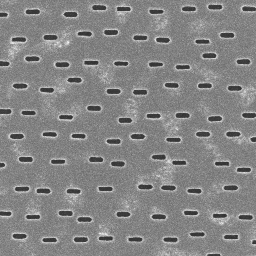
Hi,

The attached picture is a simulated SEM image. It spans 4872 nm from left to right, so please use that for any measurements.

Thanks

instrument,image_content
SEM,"a regular array of holes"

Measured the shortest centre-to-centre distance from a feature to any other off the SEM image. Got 0.452 um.